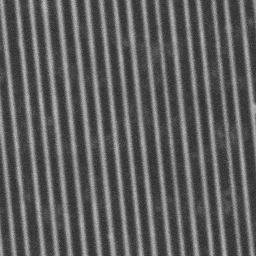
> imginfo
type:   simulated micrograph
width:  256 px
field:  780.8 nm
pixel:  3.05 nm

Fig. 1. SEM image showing parallel lines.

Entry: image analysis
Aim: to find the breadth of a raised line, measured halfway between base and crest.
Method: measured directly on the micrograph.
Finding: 11.4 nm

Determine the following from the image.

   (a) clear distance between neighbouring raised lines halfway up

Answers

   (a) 30.7 nm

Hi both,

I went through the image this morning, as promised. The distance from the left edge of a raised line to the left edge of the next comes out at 42.6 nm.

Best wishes